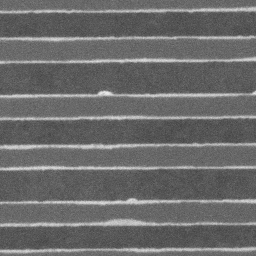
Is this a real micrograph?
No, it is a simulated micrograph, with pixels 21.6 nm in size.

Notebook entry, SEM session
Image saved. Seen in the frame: lines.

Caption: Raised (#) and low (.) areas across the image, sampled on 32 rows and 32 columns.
################################
#...............................
................................
................................
................................
################################
################################
##############################..
................................
................................
................................
................................
################################
################################
################################
................................
................................
................................
################################
################################
################################
................................
................................
................................
................................
################################
################################
################################
................................
................................
................................
################################